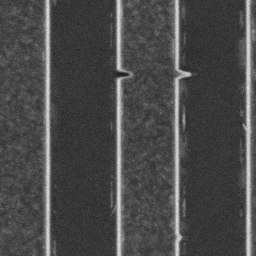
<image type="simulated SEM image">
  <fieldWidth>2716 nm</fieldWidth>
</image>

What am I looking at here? one or a few lines or trenches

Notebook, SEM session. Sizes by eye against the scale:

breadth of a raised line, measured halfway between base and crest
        629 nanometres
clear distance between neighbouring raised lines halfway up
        744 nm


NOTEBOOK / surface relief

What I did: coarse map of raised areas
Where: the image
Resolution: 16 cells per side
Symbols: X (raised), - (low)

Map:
XXX----XXXX-----
XXX----XXXX-----
XXX----XXXX-----
XXX----XXXX-----
XXX-----XXX-----
XXX----XXXX-----
XXX----XXXX-----
XXX----XXXX-----
XXX----XXXX----X
XXX----XXXX-----
XXX----XXXX-----
XXX----XXXX-----
XXX----XXXX-----
XXX----XXXX-----
XXX----XXXX-----
XXX----XXXX-----